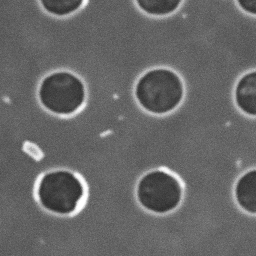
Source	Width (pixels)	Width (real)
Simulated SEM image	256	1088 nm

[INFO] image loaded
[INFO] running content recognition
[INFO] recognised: holes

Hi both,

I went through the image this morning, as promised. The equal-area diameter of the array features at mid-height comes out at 186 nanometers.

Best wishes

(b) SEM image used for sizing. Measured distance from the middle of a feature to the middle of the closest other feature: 418 nanometres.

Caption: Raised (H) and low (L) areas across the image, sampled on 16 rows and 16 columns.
HHHLLHHHHLLHHHHL
HHHHHHHHHHHHHHHH
HHHHHHHHHHHHHHHH
HHHHHHHHHHHHHHHH
HHHHHHHHHLLHHHHH
HHHLLHHHHLLHHHHL
HHHLLHHHHLLHHHHL
HHHHHHHHHHHHHHHH
HHHHHHHHHHHHHHHH
HHHHHHHHHHHHHHHH
HHHHHHHHHHHHHHHH
HHHLLHHHHLLHHHHL
HHHLLHHHHLLHHHHL
HHHHHHHHHHHHHHHH
HHHHHHHHHHHHHHHH
HHHHHHHHHHHHHHHH